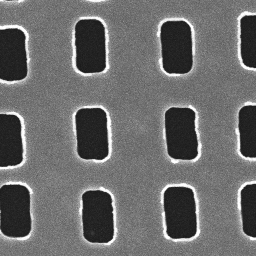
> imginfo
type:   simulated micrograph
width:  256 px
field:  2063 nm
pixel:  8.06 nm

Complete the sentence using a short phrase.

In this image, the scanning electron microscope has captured holes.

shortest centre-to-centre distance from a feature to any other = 668 nanometers